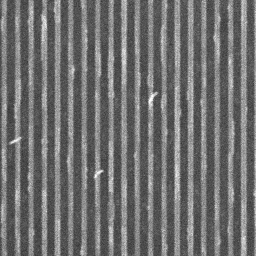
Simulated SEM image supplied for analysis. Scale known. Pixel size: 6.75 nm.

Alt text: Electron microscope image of parallel lines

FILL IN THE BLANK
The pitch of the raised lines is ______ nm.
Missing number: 90.1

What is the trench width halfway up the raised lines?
62.5 nm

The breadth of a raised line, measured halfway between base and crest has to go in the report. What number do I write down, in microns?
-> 0.0287